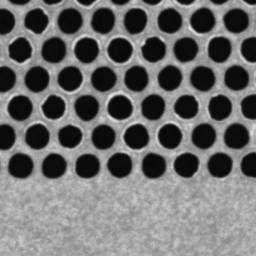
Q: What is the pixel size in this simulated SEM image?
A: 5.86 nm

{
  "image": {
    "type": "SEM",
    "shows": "a regular array of holes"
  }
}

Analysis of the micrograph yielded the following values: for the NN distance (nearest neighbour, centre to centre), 192 nm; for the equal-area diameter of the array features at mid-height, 0.147 micrometres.